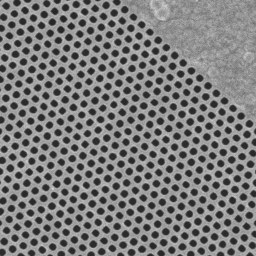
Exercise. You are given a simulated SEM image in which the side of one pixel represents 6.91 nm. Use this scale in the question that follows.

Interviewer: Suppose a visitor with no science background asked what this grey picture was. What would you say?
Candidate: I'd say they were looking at a regular array of holes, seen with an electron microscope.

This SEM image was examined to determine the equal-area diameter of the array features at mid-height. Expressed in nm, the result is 53.4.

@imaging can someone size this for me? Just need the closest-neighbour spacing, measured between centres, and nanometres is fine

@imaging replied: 75.6